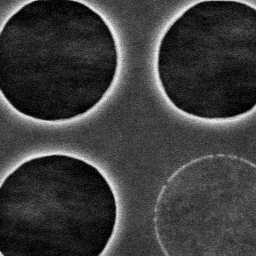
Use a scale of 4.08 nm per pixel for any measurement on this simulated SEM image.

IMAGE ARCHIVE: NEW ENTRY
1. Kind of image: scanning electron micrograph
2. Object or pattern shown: holes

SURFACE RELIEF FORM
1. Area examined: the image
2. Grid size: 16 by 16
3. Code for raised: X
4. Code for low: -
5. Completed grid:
X-----XXXXXX----
-------XXXX-----
-------XXX------
-------XXX------
-------XXX------
-------XXX------
X-----XXXXX-----
XXX-XXXXXXXXXXXX
XXXXXXXXXXXXXXXX
XXXXXXXXXXXXXXXX
X-----XXXXXXXXXX
-------XXXXXXXXX
-------XXXXXXXXX
-------XXXXXXXXX
-------XXXXXXXXX
-------XXXXXXXXX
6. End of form